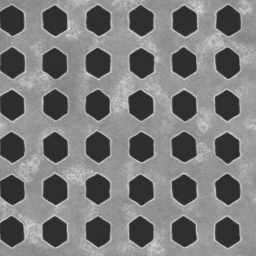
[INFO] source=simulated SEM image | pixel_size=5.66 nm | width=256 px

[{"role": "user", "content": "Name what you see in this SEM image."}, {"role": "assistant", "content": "a regular array of holes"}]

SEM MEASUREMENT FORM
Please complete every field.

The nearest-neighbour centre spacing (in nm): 237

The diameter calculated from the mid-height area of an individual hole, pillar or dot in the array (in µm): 0.153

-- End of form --